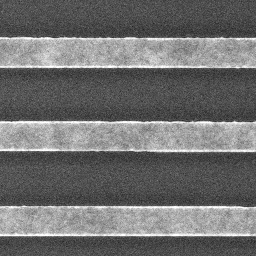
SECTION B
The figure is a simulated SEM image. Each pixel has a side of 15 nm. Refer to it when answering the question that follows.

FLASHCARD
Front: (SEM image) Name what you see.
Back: lines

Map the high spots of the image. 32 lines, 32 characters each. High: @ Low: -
--------------------------------
--------------------------------
--------------------------------
--------------------------------
--------------------------------
@@@@@@@@@@@@@@@@@@@@@@@@@@@@@@@@
@@@@@@@@@@@@@@@@@@@@@@@@@@@@@@@@
@@@@@@@@@@@@@@@@@@@@@@@@@@@@@@@@
--------------------------------
--------------------------------
--------------------------------
--------------------------------
--------------------------------
--------------------------------
--------------------------------
@@@@@@@@@@@@@@@@@@@@@@@@@@@@@@@@
@@@@@@@@@@@@@@@@@@@@@@@@@@@@@@@@
@@@@@@@@@@@@@@@@@@@@@@@@@@@@@@@@
@@@@@@@@@@@@@@@@@@@@@@@@@@@@@@@@
--------------------------------
--------------------------------
--------------------------------
--------------------------------
--------------------------------
--------------------------------
--------------------------------
@@@@@@@@@@@@@@@@@@@@@@@@@@@@@@@@
@@@@@@@@@@@@@@@@@@@@@@@@@@@@@@@@
@@@@@@@@@@@@@@@@@@@@@@@@@@@@@@@@
--------------------------------
--------------------------------
--------------------------------